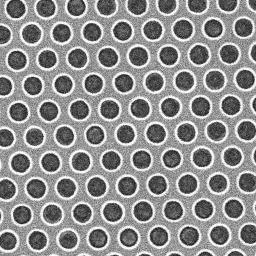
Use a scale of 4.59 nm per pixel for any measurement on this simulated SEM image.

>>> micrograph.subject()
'a regular array of holes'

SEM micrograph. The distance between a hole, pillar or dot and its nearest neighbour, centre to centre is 137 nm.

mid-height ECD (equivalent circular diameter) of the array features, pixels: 20.7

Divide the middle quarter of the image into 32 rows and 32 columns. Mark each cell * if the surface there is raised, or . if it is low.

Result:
**...*****...*****..******.*****
********************************
*******.******..*****...****....
..***....****....***.....***....
..***.....**.....***.....**.....
..***.....***....***.....***....
..***....****....****...*****...
.******.************************
**************************..****
**...*****...****....***.....***
*.....***.....**.....***.....***
*......**.....**......**.....***
**....***.....***....***....****
**....****...*****..************
******************************.*
.******..*****...****....****...
..****....***.....***....***....
...**.....***.....**......**....
...**.....***.....***....***....
..****....****...*****...*****..
..******************************
*******************.******..****
***...****....***....****....***
**.....**.....***.....***....***
**.....**.....***.....***....***
**.....***....***.....***....***
***...*****.********************
********************************
.******...****...*****...****...
...***....****....***.....**....
...***.....**.....***.....***...
...***.....**.....***.....***...